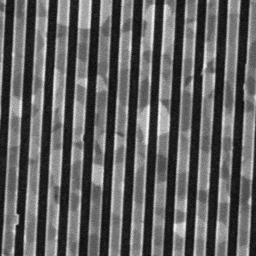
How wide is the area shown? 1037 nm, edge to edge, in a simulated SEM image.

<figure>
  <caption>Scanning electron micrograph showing parallel lines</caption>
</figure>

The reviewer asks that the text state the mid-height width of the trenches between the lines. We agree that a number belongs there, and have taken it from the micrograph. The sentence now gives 0.04 um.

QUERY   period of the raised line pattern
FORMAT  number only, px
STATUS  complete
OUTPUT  21.3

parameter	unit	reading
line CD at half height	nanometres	43.5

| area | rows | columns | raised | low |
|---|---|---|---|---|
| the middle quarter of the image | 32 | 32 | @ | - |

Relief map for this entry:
---@@@--@@@---@@---@@@--@@@---@@
---@@@--@@@---@@---@@@--@@@---@@
---@@@--@@@---@@---@@@--@@@---@@
---@@@--@@@---@@---@@@--@@@---@@
---@@@--@@@---@@---@@---@@@---@@
---@@@--@@@---@@---@@---@@@--@@@
---@@---@@@---@@---@@---@@@--@@@
---@@---@@@--@@@---@@---@@@--@@@
---@@---@@@--@@@---@@---@@---@@@
---@@---@@@--@@@---@@---@@---@@@
---@@---@@@--@@@--@@@---@@---@@@
---@@---@@@--@@@--@@@---@@---@@@
--@@@---@@@--@@@--@@@---@@---@@@
--@@@---@@---@@@--@@@---@@---@@@
---@@---@@---@@@--@@@---@@---@@@
---@@---@@---@@@--@@@---@@---@@@
--@@@---@@---@@---@@@---@@---@@@
--@@@---@@---@@---@@@---@@---@@@
--@@@---@@---@@---@@@---@@---@@@
--@@@--@@@---@@---@@@---@@---@@-
--@@@--@@@---@@---@@@--@@@---@@-
--@@@--@@@---@@---@@@--@@@---@@-
--@@@--@@@---@@---@@@--@@@---@@-
--@@@--@@@---@@---@@@--@@@---@@-
--@@@--@@@---@@---@@---@@@---@@-
--@@---@@@---@@---@@---@@@--@@@-
--@@---@@@--@@@---@@---@@@--@@@-
--@@---@@@--@@@---@@---@@@--@@@-
--@@---@@---@@@---@@---@@@--@@@-
--@@---@@---@@@---@@---@@@--@@@-
--@@---@@---@@@---@@---@@@--@@@-
--@@---@@---@@@---@@---@@---@@@-